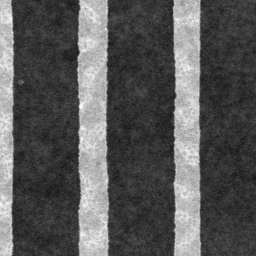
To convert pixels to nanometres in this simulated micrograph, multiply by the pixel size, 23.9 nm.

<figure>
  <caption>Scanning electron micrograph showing one or a few lines or trenches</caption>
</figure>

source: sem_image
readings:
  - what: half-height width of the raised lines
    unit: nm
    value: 608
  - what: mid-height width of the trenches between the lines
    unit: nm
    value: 1620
